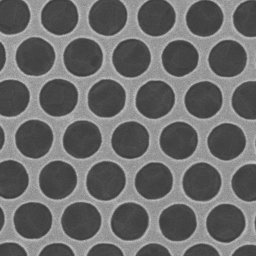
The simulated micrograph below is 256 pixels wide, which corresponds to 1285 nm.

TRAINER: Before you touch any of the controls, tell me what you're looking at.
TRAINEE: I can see a regular array of holes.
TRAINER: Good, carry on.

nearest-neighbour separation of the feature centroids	238	nm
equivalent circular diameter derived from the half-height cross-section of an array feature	194	nm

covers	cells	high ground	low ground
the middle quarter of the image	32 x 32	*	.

.........****........****.......
*........****.......*****.......
**......******.....*******.....*
****************.***************
.*******.....********....*******
...****.......*****.......******
...***.........****........****.
....**.........***..........**..
...***.........***..........**..
...***.........***..........**..
...***.........***.........***..
..*****.......****.........****.
.*******.....******.......******
**********.**********...********
**.....*********..**********..**
*.......*****.......******......
.........****........****.......
.........***.........***........
.........***.........***........
.........***.........***........
.........***.........***........
........****.........***........
*.......*****.......*****.......
***...*********....********....*
*********...**********.*********
..*****.......******......******
...***.........****.......*****.
...***.........***.........***..
...***.........***.........***..
...***.........***.........**...
...***.........***.........***..
..****.........***.........***..